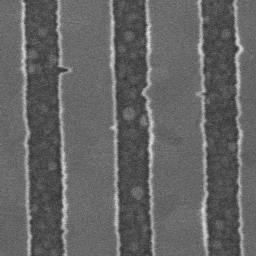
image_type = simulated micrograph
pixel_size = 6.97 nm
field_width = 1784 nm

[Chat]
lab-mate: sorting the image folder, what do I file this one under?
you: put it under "one or a few lines or trenches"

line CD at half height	377	nanometres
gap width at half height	34.1	pixels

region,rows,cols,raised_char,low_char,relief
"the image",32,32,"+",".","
+++....+++++++....+++++++....+++
+++....+++++++....+++++++....+++
+++....+++++++....+++++++....+++
+++....+++++++....+++++++....+++
+++....+++++++..+.+++++++....+++
+++....+++++++....+++++++.....++
+++....+++++++....+++++++.....++
+++...++++++++....++++++++....++
+++++...++++++.....++++++.....++
+++.....++++++....+++++++.....++
+++....+++++++....+++++++.....++
+++....+++++++....+++++++...+.++
+++....+++++++....++++++++....++
+++.....++++++....++++++++....++
+++.....++++++.++.++++++++....++
+++.....++++++....+++++++.....++
++++....+++++++....++++++.....++
+++.....+++++++....+++++++....++
+++.....+++++++....+++++++....++
+++.....+++++++....+++++++....++
+++.....++++++.....+++++++....++
+++.....+++++++....+++++++....++
+++.....+++++++....+++++++....++
++++....+++++++....+++++++....++
+++.....+++++++..+.+++++++....++
++++....+++++++....+++++++....++
++++....+++++++....+++++++....++
++++....+++++++....+++++++....++
++++....+++++++....+++++++....++
++++....+++++++....+++++++....++
++++....+++++++....+++++++....++
++++....+++++++....+++++++....++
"